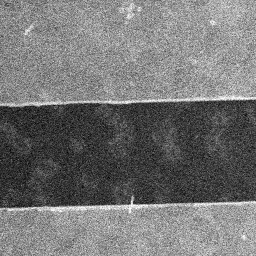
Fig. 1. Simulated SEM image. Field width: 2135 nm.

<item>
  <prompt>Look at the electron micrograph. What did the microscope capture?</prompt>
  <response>one or a few lines or trenches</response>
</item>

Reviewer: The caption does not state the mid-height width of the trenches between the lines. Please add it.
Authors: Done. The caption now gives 104 pixels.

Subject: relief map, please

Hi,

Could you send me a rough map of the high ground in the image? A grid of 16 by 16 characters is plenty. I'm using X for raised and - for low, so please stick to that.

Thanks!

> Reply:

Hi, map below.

XXXXXXXXXXXXXXXX
XXXXXXXXXXXXXXXX
XXXXXXXXXXXXXXXX
XXXXXXXXXXXXXXXX
XXXXXXXXXXXXXXXX
XXXXXXXXXXXXXXXX
XXX-------------
----------------
----------------
----------------
----------------
----------------
----------------
XXXXXXXXXXXXXXXX
XXXXXXXXXXXXXXXX
XXXXXXXXXXXXXXXX